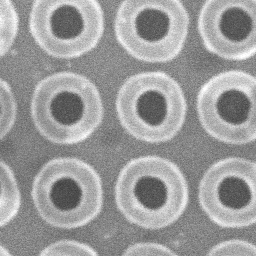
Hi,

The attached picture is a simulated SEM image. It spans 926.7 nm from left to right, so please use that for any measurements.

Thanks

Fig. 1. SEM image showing ring-shaped raised bodies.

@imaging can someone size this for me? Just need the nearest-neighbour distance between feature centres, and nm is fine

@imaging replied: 306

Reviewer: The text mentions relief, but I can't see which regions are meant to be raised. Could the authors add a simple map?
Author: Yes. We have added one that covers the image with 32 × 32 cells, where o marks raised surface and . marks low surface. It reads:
o...oooooooo...ooooooo....oooooo
oo..ooo...ooo..oo....oo..ooo...o
oo..oo....ooo..oo....oo..oo.....
oo..oo.....oo..oo....oo..oo.....
oo..ooo...ooo..oo....oo..ooo...o
o....ooooooo...oooooooo...oooooo
o.....ooooo.....oooooo.....ooooo
..................ooo...........
................................
.......ooo.......oooo......oooo.
.....oooooo.....oooooo....oooooo
o...ooo..ooo...ooo..ooo..ooo...o
oo..oo....ooo..oo....oo..oo....o
oo..oo.....oo..oo....oo..oo....o
oo..oo....ooo..oo....oo..oo....o
o...ooo..ooo...ooo..ooo..oooo.oo
o....oooooo.....oooooo....oooooo
......oooo........ooo.......ooo.
................................
................................
......ooooo.....ooooo......ooooo
o....ooooooo...ooooooo....oooooo
oo..ooo..ooo...oo...ooo..ooo..oo
oo..oo....ooo..oo....oo..oo....o
oo..oo....ooo..oo....oo..oo....o
oo..ooo...oo...ooo...oo..ooo...o
oo...ooooooo...oooooooo...oooooo
o.....ooooo.....oooooo.....ooooo
...................o............
................................
.......ooo..................ooo.
o....ooooooo....ooooo.....oooooo